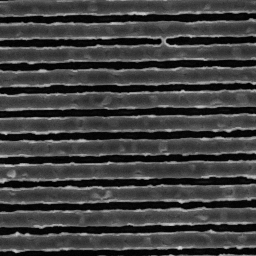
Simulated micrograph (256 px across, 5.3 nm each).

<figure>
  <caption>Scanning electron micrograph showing parallel lines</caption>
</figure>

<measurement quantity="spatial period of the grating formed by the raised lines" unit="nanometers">124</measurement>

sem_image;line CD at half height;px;16.5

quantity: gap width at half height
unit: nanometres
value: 33.8